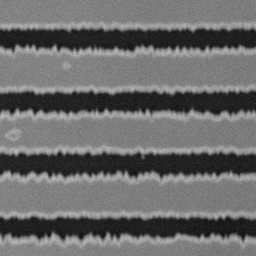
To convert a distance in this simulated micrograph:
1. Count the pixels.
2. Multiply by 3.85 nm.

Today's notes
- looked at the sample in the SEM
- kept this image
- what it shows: lines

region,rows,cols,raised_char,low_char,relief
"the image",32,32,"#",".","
################################
################################
################################
#############################.##
................................
................................
################################
################################
################################
################################
################################
#...#####...###.....##..#.#.....
................................
................................
################################
################################
################################
################################
################################
................................
................................
................................
################################
################################
################################
################################
################################
................................
................................
#.....#....#.#.#......##..#..#..
################################
################################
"